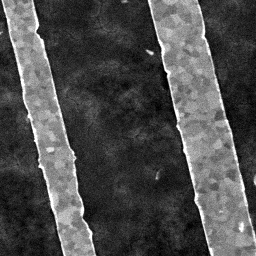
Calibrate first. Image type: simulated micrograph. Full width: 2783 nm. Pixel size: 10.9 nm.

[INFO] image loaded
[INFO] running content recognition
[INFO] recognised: one or a few lines or trenches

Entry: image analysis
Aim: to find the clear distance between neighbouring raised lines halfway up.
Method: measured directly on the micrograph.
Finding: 1220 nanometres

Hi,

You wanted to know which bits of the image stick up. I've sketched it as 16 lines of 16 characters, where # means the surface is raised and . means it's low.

##.......###....
##........###...
.##.......###...
.##.......###...
.##.......###...
.##........###..
..##.......###..
..##.......###..
..##.......####.
..###.......###.
...##.......###.
...##.......###.
...##.......###.
...##........###
....##.......###
....##.......###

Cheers